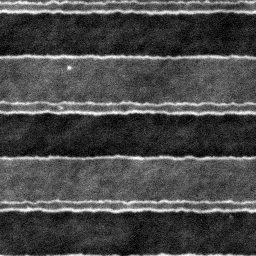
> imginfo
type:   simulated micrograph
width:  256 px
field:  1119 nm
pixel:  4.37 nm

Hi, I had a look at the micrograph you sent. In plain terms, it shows lines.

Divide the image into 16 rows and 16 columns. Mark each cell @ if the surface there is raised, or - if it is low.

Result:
@@@@@@@@@@@@@@@@
----------------
----------------
----------------
@@@@@@@@@@@@@@@@
@@@@@@@@@@@@@@@@
@@@@@@@@@@@@@@@@
----------------
----------------
----------------
@@@@@@@@@@@@@@@@
@@@@@@@@@@@@@@@@
@@@@@@@@@@@@@@@@
----------------
----------------
----------------